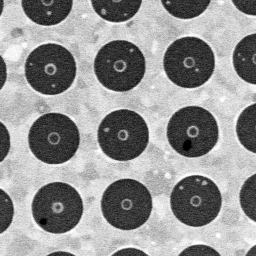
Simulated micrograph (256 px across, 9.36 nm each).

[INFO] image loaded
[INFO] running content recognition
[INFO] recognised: an array of small figures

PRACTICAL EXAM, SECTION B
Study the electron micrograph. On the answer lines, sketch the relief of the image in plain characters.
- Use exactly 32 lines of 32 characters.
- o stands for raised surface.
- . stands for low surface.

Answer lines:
ooo......oo.......oo......ooo...
ooo......ooo.....oooo.....oooo..
oooo....ooooo...oooooooooooooooo
oooooooooooooooooooooooooooooooo
ooooooooooooooooooooooo.ooooooo.
ooooo..oooooo....oooo.....oooo..
oooo.....ooo......ooo......oo...
ooo......ooo......oo...o...oo...
.oo...o...oo..o...oo.......oo...
.oo.......oo......ooo.....oooo..
.oo......ooo.....ooooo....ooooo.
oooo....oooooo.ooooooooooooooooo
oooooooooooooooooooooooooooooooo
ooooooooooooooooooooooo..oooooo.
ooooo...ooooo.....ooo......ooo..
oooo.....ooo......ooo......oo...
.ooo......oo...o...oo...o..oo...
.oo...o...oo.......oo.......oo..
.ooo......oo......ooo......oooo.
.ooo.....oooo....oooooo..ooooooo
oooooo..oooooooooooooooooooooooo
oooooooooooooooooooooooooooooooo
ooooooooooooooo..ooooo.....oooo.
ooooo....oooo.....oooo.....ooo..
.ooo......ooo......oo.......oo..
..oo......ooo..o...oo...o...oo..
..oo......ooo......ooo......oo..
..oo......ooo.....oooo.....oooo.
.oooo....ooooo...ooooooooooooooo
oooooooooooooooooooooooooooooooo
oooooooooooooooooooooooo..oooooo
oooooo...ooooo....oooo.....oooo.